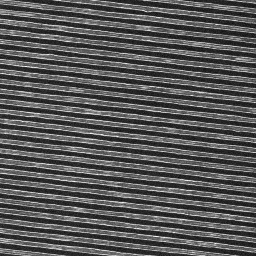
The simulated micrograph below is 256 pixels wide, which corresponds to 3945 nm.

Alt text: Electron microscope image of parallel lines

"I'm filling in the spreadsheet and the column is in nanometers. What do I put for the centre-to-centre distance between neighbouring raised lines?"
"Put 152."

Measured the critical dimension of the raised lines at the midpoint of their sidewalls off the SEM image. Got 93.7 nm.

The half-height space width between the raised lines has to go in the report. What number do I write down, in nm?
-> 57.4